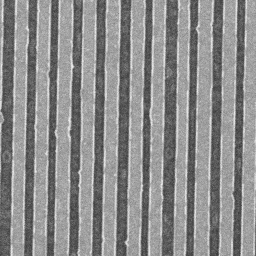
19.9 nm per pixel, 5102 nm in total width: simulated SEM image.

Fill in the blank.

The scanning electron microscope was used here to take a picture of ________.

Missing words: parallel lines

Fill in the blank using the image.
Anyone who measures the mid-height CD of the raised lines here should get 269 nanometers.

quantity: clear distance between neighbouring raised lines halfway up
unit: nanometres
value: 192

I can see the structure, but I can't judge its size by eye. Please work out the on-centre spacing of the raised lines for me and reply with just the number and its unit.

461 nanometers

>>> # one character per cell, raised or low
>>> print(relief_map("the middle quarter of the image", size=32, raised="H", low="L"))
HHLLLHHHLLHHHHLLLHHHLLHHHLLLHHHL
HHLLLHHHLLHHHLLLLHHHLLHHHLLLHHHL
HHLLLHHHLLHHHHLLLHHHLLHHHLLLHHHL
HHLLLHHHLLLHHHLLLHHHLLHHHLLLHHHL
HHLLLHHHLLLHHHLLLHHHLLHHHLLLHHHL
HHLLLHHHLLLHHHLLLHHHLLHHHLLLHHHL
HHLLHHHHLLLHHHLLLHHHLLHHHLLLHHHL
HHLLHHHHLLHHHHLLLHHHLLHHHLLLHHHL
HHLLHHHHLLHHHHLLLHHHLLHHHLLLHHHL
HHLLHHHHLLHHHHLLLHHHLLHHHLLLHHHL
HHLLHHHHLLHHHHLLLHHHLLHHHLLLHHHL
HHLLHHHHLLHHHHLLLHHHLLHHHLLLHHHL
HHLLHHHHLLHHHHLLHHHHLLHHHLLLHHHL
HHLLLHHLLLHHHHLLLHHHLLHHHLLLHHHL
HHLLLHHLLLHHHLLLLHHHLLHHHLLLHHHL
HLLLLHHLLLHHHLLLHHHLLLHHHLLLHHHL
HLLLLHHLLLHHHLLLHHHLLLHHHLLLHHHL
HLLLLHHLLLHHHLLLHHHLLLHHHLLLHHHL
HLLLLHHLLLHHHLLLLHHLLLHHHLLLHHHL
HLLLHHHLLLHHHLLLHHHLLLHHHLLLHHHL
HLLLHHHLLLHHHLLLHHHLLLHHHLLLHHHL
HLLLHHHLLLHHHLLLHHHLLLHHHLLLHHHL
HLLLHHHLLLHHHLLLHHHHLLHHHLLLHHHL
HLLLHHHHLLHHHLLLHHHHLLHHHLLLHHHL
HLLLHHHHLLHHHLLLHHHHLLHHHLLLHHHL
HLLLHHHLLLHHHLLLHHHHLLHHHLLLHHHL
HLLLHHHLLLHHHLLLHHHHLLHHHLLLHHHL
HLLLHHHLLLHHHLLLHHHHLLHHHLLLHHHL
HLLLHHHLLLHHHLLLHHHLLLHHHLLLHHHL
HLLLHHHLLLHHHLLLHHHLLLHHHLLLHHHL
HLLLHHHLLLHHHLLLHHHHLLHHLLLLHHHL
HLLLHHHLLLHHHLLLHHHHLLHHLLLLHHLL